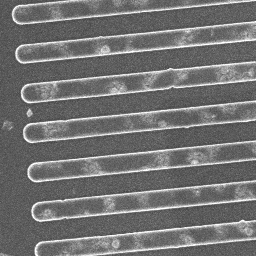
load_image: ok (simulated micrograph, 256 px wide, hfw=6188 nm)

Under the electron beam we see parallel lines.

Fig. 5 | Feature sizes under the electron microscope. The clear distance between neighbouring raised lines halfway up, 0.499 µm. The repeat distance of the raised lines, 956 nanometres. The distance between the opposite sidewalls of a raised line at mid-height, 457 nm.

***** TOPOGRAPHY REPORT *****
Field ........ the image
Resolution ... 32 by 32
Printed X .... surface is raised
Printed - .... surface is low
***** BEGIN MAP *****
-----XXXXXXXXXXXXXXXXXXXXXXX----
--XXXXXXXXXXXXXXXX--------------
--XXXXXX------------------------
------------------------XXXXXXXX
--------------XXXXXXXXXXXXXXXXXX
----XXXXXXXXXXXXXXXXXXXXXX------
--XXXXXXXXXXXXXX----------------
--XXXXX-------------------------
------------------------XXXXXXXX
--------------XXXXXXXXXXXXXXXXXX
----XXXXXXXXXXXXXXXXXXXXXXX-----
---XXXXXXXXXXXXXX---------------
---XXXX-------------------------
-----------------------XXXXXXXXX
--------------XXXXXXXXXXXXXXXXXX
----XXXXXXXXXXXXXXXXXXXXXXX-----
---XXXXXXXXXXXXXX---------------
---XXXX-------------------------
-----------------------XXXXXXXXX
-------------XXXXXXXXXXXXXXXXXXX
----XXXXXXXXXXXXXXXXXXXXXX------
----XXXXXXXXXXXXX---------------
----XXX-------------------------
-----------------------XXXXXXXXX
-------------XXXXXXXXXXXXXXXXXXX
----XXXXXXXXXXXXXXXXXXXXXX------
----XXXXXXXXXXXX----------------
-----X--------------------------
----------------------XXXXXXXXXX
--------------XXXXXXXXXXXXXXXXXX
-----XXXXXXXXXXXXXXXXXXXXX------
----XXXXXXXXXXXX----------------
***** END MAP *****